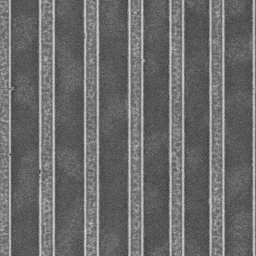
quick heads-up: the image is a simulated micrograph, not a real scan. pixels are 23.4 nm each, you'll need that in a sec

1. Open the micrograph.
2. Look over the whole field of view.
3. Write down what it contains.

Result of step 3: parallel lines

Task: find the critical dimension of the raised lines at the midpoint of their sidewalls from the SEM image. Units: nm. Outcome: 299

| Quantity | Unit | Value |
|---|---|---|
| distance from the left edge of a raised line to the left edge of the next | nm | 996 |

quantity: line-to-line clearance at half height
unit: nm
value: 724